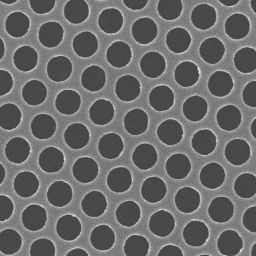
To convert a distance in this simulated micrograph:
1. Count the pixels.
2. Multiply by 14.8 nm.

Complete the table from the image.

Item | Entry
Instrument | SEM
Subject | a regular array of holes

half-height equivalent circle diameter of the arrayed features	381	nm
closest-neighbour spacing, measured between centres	513	nm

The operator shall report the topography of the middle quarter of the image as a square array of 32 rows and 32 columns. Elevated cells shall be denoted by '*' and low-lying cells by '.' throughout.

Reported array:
..*****.****...****.......**....
..***.....*********......***....
..**......**********....****....
.***......****....****.*****....
****......***......*********....
*****.....***......*****..****..
..****...****......***.....*****
....*********......**......*****
....**********....***.......***.
....****....*********......***..
....***.....**********.....***..
....**.......****...***...****..
..****......****.....*********..
*******.....***......**********.
*******....****......****....***
*....**********......***.....***
......*********.....***.......**
......*****..****..****.......**
......***.....**********......**
......***......**********....***
*....****......***....**********
*********......***.....*********
*********.....***......*****..**
****...***...****......***.....*
***.....*********......***......
**......**********....***.......
**.......***....**********......
**......***......*********.....*
***.....***......****...***...**
****..*****......***.....*******
..*********......**......*******
..**********....***.......***...